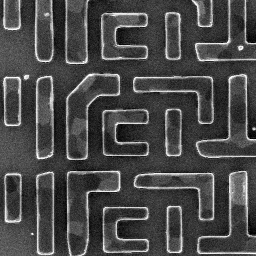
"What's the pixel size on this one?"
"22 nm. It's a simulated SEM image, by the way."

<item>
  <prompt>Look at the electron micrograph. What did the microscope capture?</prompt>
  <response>wiring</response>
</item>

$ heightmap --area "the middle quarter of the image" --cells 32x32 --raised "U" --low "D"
DDDDDDDDDDDDDDDDDDDDDDDDDDDDDDDD
DDDDDDDDDDDDDDDDDDDDDDDDDDDDDDDD
DDDDDDDUUUUUDDDDDDDDDDDDDDDDDDDD
DDDDDUUUUUUUUUDDDDUUUUUUUUUUUUUU
DDDDUUUUUUUUUUDDDUUUUUUUUUUUUUUU
DDDUUUUUUUUUUUDDDUUUUUUUUUUUUUUU
DDUUUUUUUUUUUUDDDDUUUUUUUUUUUUUU
DDUUUUUUUUUUUUDDDDDDDDDDDDDDDDDD
DUUUUUUUDDDDDDDDDDDDDDDDDDDDDDDD
DUUUUUUDDDDDDDDDDDDDDDDDDDDDDDDD
DUUUUUDDDDDDDDDDDDDDDDDDDDDDDDDD
DUUUUUDDDDDDDUUUUUUUUDDDDDUUUDDD
DUUUUUDDDDUUUUUUUUUUUDDDDUUUUDDD
DUUUUUDDDDUUUUUUUUUUUDDDDUUUUDDD
DUUUUUDDDDUUUUUUUUUUUDDDDUUUUDDD
DUUUUUDDDDUUUDDDDDDDDDDDDUUUUDDD
DUUUUUDDDDUUUDDDDDDDDDDDDUUUUDDD
DUUUUUDDDDUUUDDDDDDDDDDDDUUUUDDD
DUUUUUDDDDUUUDDDDDDDDDDDDUUUUDDD
DUUUUUDDDDUUUDDDDDDDDDDDDUUUUDDD
DUUUUUDDDDUUUUUUUUUUUDDDDUUUUDDD
DUUUUUDDDDUUUUUUUUUUUDDDDDUUUDDD
DUUUUUDDDDUUUUUUUUUUUDDDDDUUUDDD
DUUUUUDDDDDDDDDDDDDDDDDDDDDDDDDD
DDDDDDDDDDDDDDDDDDDDDDDDDDDDDDDD
DDDDDDDDDDDDDDDDDDDDDDDDDDDDDDDD
DDDDDDDDDDDDDDDDDDDDDDDDDDDDDDDD
DUUUUUUUUUUUUUDDDDDDDDUUUUUUUUUU
DUUUUUUUUUUUUUDDDDUUUUUUUUUUUUUU
DUUUUUUUUUUUUUDDDDUUUUUUUUUUUUUU
DUUUUUUUUUUUUUDDDDUUUUUUUUUUUUUU
DUUUUUUUUUUUUUDDDDDDDDDDDDDDDDDD